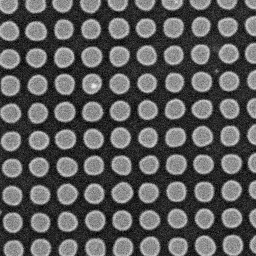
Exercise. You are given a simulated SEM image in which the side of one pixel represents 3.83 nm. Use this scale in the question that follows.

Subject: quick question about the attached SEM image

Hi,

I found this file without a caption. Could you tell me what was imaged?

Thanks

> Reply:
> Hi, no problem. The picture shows an array of small figures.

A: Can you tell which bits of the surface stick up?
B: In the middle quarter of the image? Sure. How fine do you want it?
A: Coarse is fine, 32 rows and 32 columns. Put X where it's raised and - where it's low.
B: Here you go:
X-----XX-----X------------------
--------------------------------
---------------------------X----
XX---XXXX---XXXX---XXXX---XXXX--
XXX--XXXX---XXXX--XXXXX---XXXX--
XXX--XXXX---XXXX---XXXX---XXXX--
XX---XXXX---XXXX---XXX----XXX---
X-------------------------------
--------------------------------
-------------XX-----XX----XXX---
XX---XXXX---XXXX---XXXX---XXXX--
XXX--XXXXX--XXXX---XXXX--XXXXX--
XXX--XXXXX--XXXX---XXXX--XXXXX--
XX---XXXX---XXXX----XX-----X----
--------------------------------
--------------------------------
------XX-----XXX----XX----XXXX--
XX---XXXX---XXXX---XXXX---XXXX--
XXX--XXXXX--XXXX---XXXX--XXXXX--
XXX--XXXXX--XXXX---XXXX---XXXX--
XX----XXX----XX-----XX-----XX---
--------------------------------
--------------------------------
X-----XXX----XXX----XXX---XXXX--
XXX--XXXXX--XXXXX--XXXXX--XXXX--
XXX--XXXXX--XXXXX--XXXXX--XXXX--
XXX--XXXXX--XXXXX--XXXX---XXXX--
XX----XX------XX----------------
--------------------------------
--------------------------------
XX----XXX----XXX---XXXX---XXXX--
XXX---XXXX--XXXXX--XXXX---XXXX--